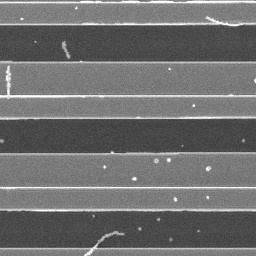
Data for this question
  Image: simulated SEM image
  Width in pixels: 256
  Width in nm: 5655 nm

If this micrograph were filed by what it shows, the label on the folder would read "lines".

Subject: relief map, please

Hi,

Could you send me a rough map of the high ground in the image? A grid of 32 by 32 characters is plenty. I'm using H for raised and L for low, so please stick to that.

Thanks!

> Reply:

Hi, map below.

HHHHHHHHHHHHHHHHHHHHHHHHHHHHHHHH
HHHHHHHHHHHHHHHHHHHHHHHHHHHHHHHH
HHHHHHHHHHHHHHHHHHHHHHHHHHHHHHHH
LLLLLLLLLLLLLLLLLLLLLLLLLLLLLLLL
LLLLLLLLLLLLLLLLLLLLLLLLLLLLLLLL
LLLLLLLLLLLLLLLLLLLLLLLLLLLLLLLL
LLLLLLLLLLLLLLLLLLLLLLLLLLLLLLLL
LLLLLLLLLLLLLLLLLLLLLLLLLLLLLLLL
HHHHHHHHHHHHHHHHHHHHHHHHHHHHHHHH
HHHHHHHHHHHHHHHHHHHHHHHHHHHHHHHH
HHHHHHHHHHHHHHHHHHHHHHHHHHHHHHHH
HHHHHHHHHHHHHHHHHHHHHHHHHHHHHHHH
HHHHHHHHHHHHHHHHHHHHHHHHHHHHHHHH
HHHHHHHHHHHHHHHHHHHHHHHHHHHHHHHH
HHHHHHHHHHHHHHHHHHHHHHHHHHHHHHHH
LLLLLLLLLLLLLLLLLLLLLLLLLLLLLLLL
LLLLLLLLLLLLLLLLLLLLLLLLLLLLLLLL
LLLLLLLLLLLLLLLLLLLLLLLLLLLLLLLL
LLLLLLLLLLLLLLLLLLLLLLLLLLLLLLLL
HHHHHHHHHHHHHHHHHHHHHHHHHHHHHHHH
HHHHHHHHHHHHHHHHHHHHHHHHHHHHHHHH
HHHHHHHHHHHHHHHHHHHHHHHHHHHHHHHH
HHHHHHHHHHHHHHHHHHHHHHHHHHHHHHHH
HHHHHHHHHHHHHHHHHHHHHHHHHHHHHHHH
HHHHHHHHHHHHHHHHHHHHHHHHHHHHHHHH
HHHHHHHHHHHHHHHHHHHHHHHHHHHHHHHH
LLLLLLLLLLLLLLLLLLLLLLLLLLLLLLLL
LLLLLLLLLLLLLLLLLLLLLLLLLLLLLLLL
LLLLLLLLLLLLLLLLLLLLLLLLLLLLLLLL
LLLLLLLLLLLLLLLLLLLLLLLLLLLLLLLL
LLLLLLLLLLLLLLLLLLLLLLLLLLLLLLLL
HHHHHHHHHHHHHHHHHHHHHHHHHHHHHHHH